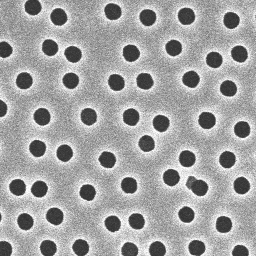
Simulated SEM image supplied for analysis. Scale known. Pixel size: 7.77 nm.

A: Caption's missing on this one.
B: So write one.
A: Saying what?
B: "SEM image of a regular array of holes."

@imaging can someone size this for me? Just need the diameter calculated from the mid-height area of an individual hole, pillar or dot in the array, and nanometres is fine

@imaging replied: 134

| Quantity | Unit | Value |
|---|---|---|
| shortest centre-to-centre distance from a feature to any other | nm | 234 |